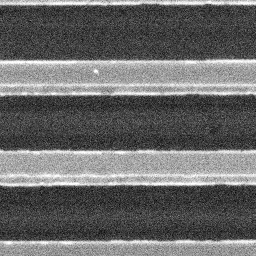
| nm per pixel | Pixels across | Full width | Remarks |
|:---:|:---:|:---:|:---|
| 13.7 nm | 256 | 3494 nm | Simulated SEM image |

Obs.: lines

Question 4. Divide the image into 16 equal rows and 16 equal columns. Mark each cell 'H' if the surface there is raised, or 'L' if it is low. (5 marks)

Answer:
LLLLLLLLLLLLLLLL
LLLLLLLLLLLLLLLL
LLLLLLLLLLLLLLLL
LLLLLLLLLLLLLLLL
HHHHHHHHHHHHHHHH
HHHHHHHHHHHHHHHH
LLLLLLLLLLLLLLLL
LLLLLLLLLLLLLLLL
LLLLLLLLLLLLLLLL
HHHHHHHHHHHHHHHH
HHHHHHHHHHHHHHHH
HHHHHHHHLHHHHLLL
LLLLLLLLLLLLLLLL
LLLLLLLLLLLLLLLL
LLLLLLLLLLLLLLLL
HHHHHHHHHHHHHHHH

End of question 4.